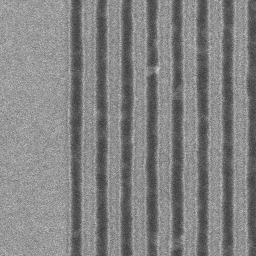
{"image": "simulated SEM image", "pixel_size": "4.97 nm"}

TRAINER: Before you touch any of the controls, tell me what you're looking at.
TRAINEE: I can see parallel lines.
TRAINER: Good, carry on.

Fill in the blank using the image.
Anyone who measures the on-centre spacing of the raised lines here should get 126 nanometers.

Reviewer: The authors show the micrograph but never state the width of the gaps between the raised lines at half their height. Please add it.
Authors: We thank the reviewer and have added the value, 0.0535 µm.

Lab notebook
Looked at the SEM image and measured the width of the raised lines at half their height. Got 72.1 nm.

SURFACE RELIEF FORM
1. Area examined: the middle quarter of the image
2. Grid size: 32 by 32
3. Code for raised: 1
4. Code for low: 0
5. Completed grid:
01111000111000111100111100011100
01111000111000111100111100011100
01111000111000111100111100011100
01111000111000111100111100011100
01111000111000111100111100011100
01111000111000111100111100011100
01111000111000111100111100011100
01111000111000111100111100011100
01111000111000111100111100011100
01111000111000111100111100011100
01111000111000111100111100011100
01111000111000111100111100011100
01111000011000111100111100011100
01111000111000111100111100011100
01111000111000111100111100011100
01111000111000111000111100011100
01111000111000111100111100011100
01111000101000111000111100111100
01111000111000111000111100011100
01111000111000111100111100011100
01111000111000111000111100011100
01111000111000111100111100011100
01111000111000111000111100011100
01111000111000111000111100011100
01111000111000111000111100011100
01111000111000111000111100011100
01111000111000111000111100111100
01111000111000111000111100011100
01111000111000111000111100111100
01111000111000111000111100111100
01111000111000111000111100111100
01111000111000111000111100111100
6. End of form